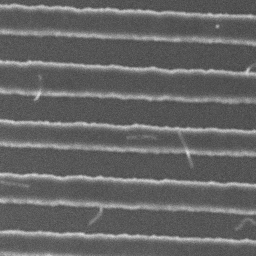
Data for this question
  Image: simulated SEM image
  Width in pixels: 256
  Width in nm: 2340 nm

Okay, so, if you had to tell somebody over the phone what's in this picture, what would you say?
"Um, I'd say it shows lines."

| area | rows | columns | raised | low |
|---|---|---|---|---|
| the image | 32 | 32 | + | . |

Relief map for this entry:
................................
++++++++++++++++++++++..........
++++++++++++++++++++++++++++++++
++++++++++++++++++++++++++++++++
.........+++++++++++++++++++++++
................................
................................
................................
++++++++++++++++................
++++++++++++++++++++++++++++++++
++++++++++++++++++++++++++++++++
++++++++++++++++++++++++++++++++
......................++++++++++
................................
................................
++++++++++++....................
++++++++++++++++++++++++++++++++
++++++++++++++++++++++++++++++++
..........++++++++++++++++++++++
................................
................................
................................
+++++++++++++++++++.............
++++++++++++++++++++++++++++++++
++++++++++++++++++++++++++++++++
.........+++++++++++++++++++++++
.............................+++
................................
................................
++++++++++++++++++++............
++++++++++++++++++++++++++++++++
++++++++++++++++++++++++++++++++